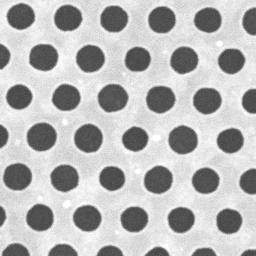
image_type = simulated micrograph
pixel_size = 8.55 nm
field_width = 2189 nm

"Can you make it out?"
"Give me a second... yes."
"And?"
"a regular array of holes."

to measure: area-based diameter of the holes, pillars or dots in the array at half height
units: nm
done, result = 246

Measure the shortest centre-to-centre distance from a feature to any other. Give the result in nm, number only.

393